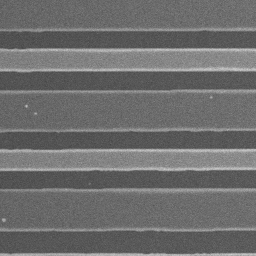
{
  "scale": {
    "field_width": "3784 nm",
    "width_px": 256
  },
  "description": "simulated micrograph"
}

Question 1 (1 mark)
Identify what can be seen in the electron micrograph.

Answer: lines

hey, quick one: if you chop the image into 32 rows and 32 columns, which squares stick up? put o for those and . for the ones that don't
oooooooooooooooooooooooooooooooo
oooooooooooooooooooooooooooooooo
oooooooooooooooooooooooooooooooo
oooooooooooooooooooooooooooooooo
................................
................................
oooooooooooooooooooooooooooooooo
oooooooooooooooooooooooooooooooo
oooooooooooooooooooooooooooooooo
................................
................................
oooooooooooooooooooooooooooooooo
oooooooooooooooooooooooooooooooo
oooooooooooooooooooooooooooooooo
oooooooooooooooooooooooooooooooo
oooooooooooooooooooooooooooooooo
................................
................................
................................
oooooooooooooooooooooooooooooooo
oooooooooooooooooooooooooooooooo
................................
................................
................................
oooooooooooooooooooooooooooooooo
oooooooooooooooooooooooooooooooo
oooooooooooooooooooooooooooooooo
oooooooooooooooooooooooooooooooo
oooooooooooooooooooooooooooooooo
................................
................................
................................